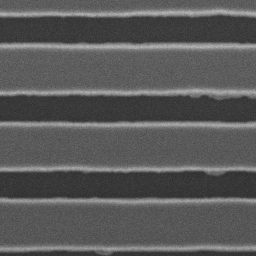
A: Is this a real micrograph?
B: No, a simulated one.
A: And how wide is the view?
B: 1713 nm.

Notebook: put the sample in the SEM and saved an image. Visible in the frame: lines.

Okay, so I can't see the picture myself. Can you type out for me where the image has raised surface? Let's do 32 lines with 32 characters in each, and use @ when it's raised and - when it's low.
@@@@@@@@@@@@@@@@@@@@@@@@@@@@@@@@
@@@@@@@@@@@@@@@@@@@@@@@@@@@@@@@@
--------------------------------
--------------------------------
--------------------------------
--------------------------------
@@@@@@@@@@@@@@@@@@@@@@@@@@@@@@@@
@@@@@@@@@@@@@@@@@@@@@@@@@@@@@@@@
@@@@@@@@@@@@@@@@@@@@@@@@@@@@@@@@
@@@@@@@@@@@@@@@@@@@@@@@@@@@@@@@@
@@@@@@@@@@@@@@@@@@@@@@@@@@@@@@@@
@@@@@@@@@@@@@@@@@@@@@@@@@@@@@@@@
--------------------------------
--------------------------------
--------------------------------
@@@@@@@@@@@@@@@@@@@@@@@@@@@@@@@@
@@@@@@@@@@@@@@@@@@@@@@@@@@@@@@@@
@@@@@@@@@@@@@@@@@@@@@@@@@@@@@@@@
@@@@@@@@@@@@@@@@@@@@@@@@@@@@@@@@
@@@@@@@@@@@@@@@@@@@@@@@@@@@@@@@@
@@@@@@@@@@@@@@@@@@@@@@@@@@@@@@@@
--------------------------------
--------------------------------
--------------------------------
--------------------------------
@@@@@@@@@@@@@@@@@@@@@@@@@@@@@@@@
@@@@@@@@@@@@@@@@@@@@@@@@@@@@@@@@
@@@@@@@@@@@@@@@@@@@@@@@@@@@@@@@@
@@@@@@@@@@@@@@@@@@@@@@@@@@@@@@@@
@@@@@@@@@@@@@@@@@@@@@@@@@@@@@@@@
@@@@@@@@@@@@@@@@@@@@@@@@@@@@@@@@
--------------------------------